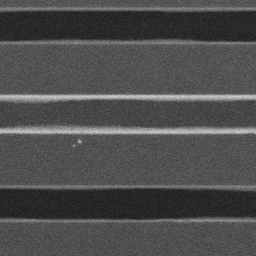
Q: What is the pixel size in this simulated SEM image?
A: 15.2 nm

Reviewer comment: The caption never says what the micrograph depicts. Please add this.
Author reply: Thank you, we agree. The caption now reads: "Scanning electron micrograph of lines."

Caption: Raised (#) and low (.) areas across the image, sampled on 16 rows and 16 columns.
################
................
................
################
################
################
################
################
################
################
################
################
................
................
################
################